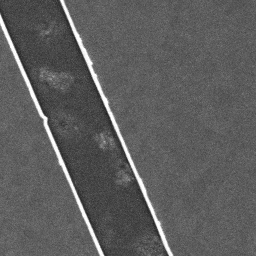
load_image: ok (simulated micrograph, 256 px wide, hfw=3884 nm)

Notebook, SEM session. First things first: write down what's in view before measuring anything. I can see one or a few lines or trenches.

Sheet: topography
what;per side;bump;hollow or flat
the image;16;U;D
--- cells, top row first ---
DDDDUUUUUUUUUUUU
DDDDUUUUUUUUUUUU
UDDDDUUUUUUUUUUU
UDDDDUUUUUUUUUUU
UDDDDDUUUUUUUUUU
UUDDDDUUUUUUUUUU
UUDDDDDUUUUUUUUU
UUUDDDDUUUUUUUUU
UUUDDDDUUUUUUUUU
UUUUDDDDUUUUUUUU
UUUUDDDDUUUUUUUU
UUUUDDDDDUUUUUUU
UUUUUDDDDUUUUUUU
UUUUUDDDDDUUUUUU
UUUUUUDDDDUUUUUU
UUUUUUDDDDUUUUUU